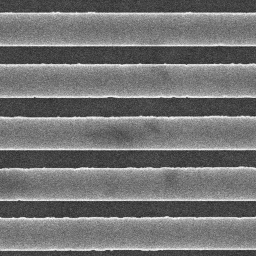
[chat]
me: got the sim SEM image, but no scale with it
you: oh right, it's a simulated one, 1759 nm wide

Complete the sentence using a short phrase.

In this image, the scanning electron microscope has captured lines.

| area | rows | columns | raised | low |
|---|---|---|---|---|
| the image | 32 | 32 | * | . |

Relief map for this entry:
................................
................................
********************************
********************************
********************************
********************************
................................
................................
********************************
********************************
********************************
********************************
................................
................................
................................
********************************
********************************
********************************
********************************
................................
................................
********************************
********************************
********************************
********************************
................................
................................
********************************
********************************
********************************
********************************
................................